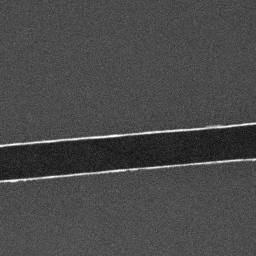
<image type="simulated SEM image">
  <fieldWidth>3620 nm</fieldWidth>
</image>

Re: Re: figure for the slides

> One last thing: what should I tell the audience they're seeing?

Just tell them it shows one or a few lines or trenches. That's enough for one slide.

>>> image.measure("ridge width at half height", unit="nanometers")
504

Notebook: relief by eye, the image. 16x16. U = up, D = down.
DDDDDDDDDDDDDDDD
DDDDDDDDDDDDDDDD
DDDDDDDDDDDDDDDD
DDDDDDDDDDDDDDDD
DDDDDDDDDDDDDDDD
DDDDDDDDDDDDDDDD
DDDDDDDDDDDDDDDD
DDDDDDDDDDDDDDDD
DDDDDDDUUUUUUUUU
UUUUUUUUUUUUUUUU
UUUUUUUUUDDDDDDD
DDDDDDDDDDDDDDDD
DDDDDDDDDDDDDDDD
DDDDDDDDDDDDDDDD
DDDDDDDDDDDDDDDD
DDDDDDDDDDDDDDDD